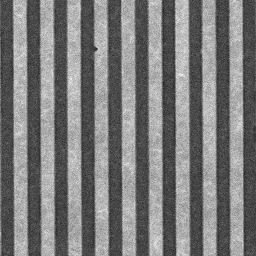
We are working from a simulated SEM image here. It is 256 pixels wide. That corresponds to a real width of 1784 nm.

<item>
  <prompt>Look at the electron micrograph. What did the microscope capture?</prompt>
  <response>parallel lines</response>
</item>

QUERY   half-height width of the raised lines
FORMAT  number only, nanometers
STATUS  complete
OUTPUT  95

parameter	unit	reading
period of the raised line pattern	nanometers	188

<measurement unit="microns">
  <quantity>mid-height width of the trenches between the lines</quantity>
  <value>0.0959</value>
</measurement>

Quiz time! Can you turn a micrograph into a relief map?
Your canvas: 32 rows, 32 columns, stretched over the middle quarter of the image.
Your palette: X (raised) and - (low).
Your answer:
-XXX----XXX----XXX---XXX----XXX-
-XXX----XXX----XXX---XXX----XXX-
-XXX----XXX----XXX---XXX----XXX-
-XXX----XXX----XXX---XXX----XXX-
-XXX----XXX----XXX---XXX----XXX-
-XXX----XXX----XXX---XXX----XXX-
-XXX----XXX----XXX---XXX----XXX-
-XXX----XXX----XXX---XXX----XXX-
-XXX----XXX----XXX---XXX----XXX-
-XXX----XXX----XXX---XXX----XXX-
-XXX----XXX----XXX---XXX----XXX-
-XXX----XXX----XXX---XXX----XXX-
-XXX----XXX----XXX---XXX----XXX-
-XXX----XXX----XXX---XXX----XXX-
-XXX----XXX----XXX---XXX----XXX-
-XXX----XXX----XXX---XXX----XXX-
-XXX----XXX----XXX---XXX----XXX-
-XXX----XXX----XXX---XXX----XXX-
-XXX----XXX----XXX---XXX----XXX-
-XXX----XXX----XXX---XXX----XXX-
-XXX----XXX----XXX---XXX----XXX-
-XXX----XXX----XXX---XXX----XXX-
-XXX----XXX----XXX---XXX----XXX-
-XXX----XXX----XXX---XXX----XXX-
-XXX----XXX----XXX---XXX----XXX-
-XXX----XXX----XXX----XX----XXX-
-XXX----XXX----XXX----XX----XXX-
-XXX----XXX----XXX----XX----XXX-
-XXX----XXX----XXX----XXX---XXX-
-XXX----XXX----XXX----XXX---XXX-
-XXX----XXX----XXX---XXXX---XXX-
-XXX----XXX----XXX---XXXX---XXX-